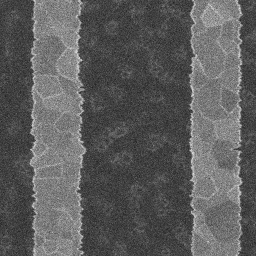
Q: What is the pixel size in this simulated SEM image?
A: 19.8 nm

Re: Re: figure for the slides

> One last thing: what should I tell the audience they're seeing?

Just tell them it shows one or a few lines or trenches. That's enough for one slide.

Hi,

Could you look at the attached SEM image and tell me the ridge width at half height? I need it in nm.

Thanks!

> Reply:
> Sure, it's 930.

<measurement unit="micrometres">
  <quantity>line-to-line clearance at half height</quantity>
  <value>2.19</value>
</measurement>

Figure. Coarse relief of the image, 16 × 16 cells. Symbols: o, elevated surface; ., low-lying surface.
..ooo.......ooo.
..ooo.......ooo.
..ooo.......ooo.
..ooo.......ooo.
..ooo.......ooo.
..ooo.......ooo.
..ooo.......ooo.
..ooo.......ooo.
..ooo.......ooo.
..ooo.......ooo.
..ooo.......ooo.
..ooo.......ooo.
..ooo.......ooo.
..ooo.......ooo.
..ooo.......ooo.
..ooo.......ooo.